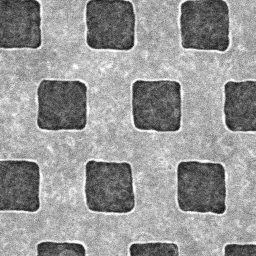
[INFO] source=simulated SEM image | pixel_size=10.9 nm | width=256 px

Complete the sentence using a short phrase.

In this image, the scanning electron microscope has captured holes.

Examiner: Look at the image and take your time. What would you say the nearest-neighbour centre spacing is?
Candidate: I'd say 1000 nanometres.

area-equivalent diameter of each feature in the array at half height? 55.1 pixels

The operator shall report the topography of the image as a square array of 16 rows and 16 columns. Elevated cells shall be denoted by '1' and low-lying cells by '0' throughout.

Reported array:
0001100011100011
0001100011100011
0001100011100011
1111111111111111
1111111111111111
1100011100011100
1100011100011100
1100011100011100
1111111111111111
1111111111111111
0011100011100011
0001100011100011
0011100011100011
1111111111111111
1111111111111111
1100011100011100